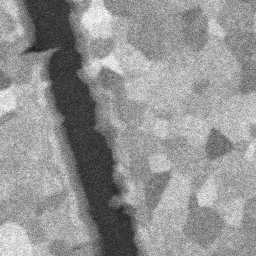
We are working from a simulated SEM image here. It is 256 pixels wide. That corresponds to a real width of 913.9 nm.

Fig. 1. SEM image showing one or a few lines or trenches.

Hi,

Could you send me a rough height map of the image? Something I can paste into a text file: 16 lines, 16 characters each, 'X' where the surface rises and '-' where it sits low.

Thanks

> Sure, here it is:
X----XXXXXXXXXXX
X----XXXXXXXXXXX
XX---XXXXXXXXXXX
XXX--XXXXXXXXXXX
XXX--XXXXXXXXXXX
XXX---XXXXXXXXXX
XXX----XXXXXXXXX
XXX----XXXXXXXXX
XXXX---XXXXXXXXX
XXXX---XXXXXXXXX
XXXX---XXXXXXXXX
XXXXX---XXXXXXXX
XXXXX---XXXXXXXX
XXXXX---XXXXXXXX
XXXXXX---XXXXXXX
XXXXXX---XXXXXXX